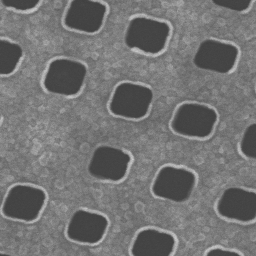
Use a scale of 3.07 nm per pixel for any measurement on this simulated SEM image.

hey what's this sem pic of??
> a regular array of holes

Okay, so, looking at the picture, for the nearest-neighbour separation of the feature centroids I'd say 0.206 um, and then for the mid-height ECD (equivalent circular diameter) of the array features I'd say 114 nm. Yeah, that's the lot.